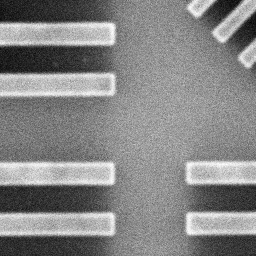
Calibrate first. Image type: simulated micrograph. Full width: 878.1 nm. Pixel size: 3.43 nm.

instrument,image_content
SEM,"groups of lines, slits or small figures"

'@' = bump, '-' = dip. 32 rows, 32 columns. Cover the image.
------------------------@@----@@
------------------------@----@@@
----------------------------@@@-
@@@@@@@@@@@@@@-------------@@@--
@@@@@@@@@@@@@@-------------@@---
@@-----------------------------@
------------------------------@@
------------------------------@@
--------------------------------
@@@@@@@@@@@@@@------------------
@@@@@@@@@@@@@@------------------
@@@@@@@@@@@@@@------------------
--------------------------------
--------------------------------
--------------------------------
--------------------------------
--------------------------------
--------------------------------
--------------------------------
--------------------------------
@@@@@@@@@@@@@@----------@@@@@@@@
@@@@@@@@@@@@@@---------@@@@@@@@@
@@@@@@@@@@@@@@---------@@@@@@@@@
--------------------------------
--------------------------------
--------------------------------
--------------------------------
@@@@@@@@@@@@@@---------@@@@@@@@@
@@@@@@@@@@@@@@---------@@@@@@@@@
--------------------------------
--------------------------------
--------------------------------